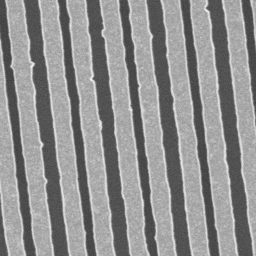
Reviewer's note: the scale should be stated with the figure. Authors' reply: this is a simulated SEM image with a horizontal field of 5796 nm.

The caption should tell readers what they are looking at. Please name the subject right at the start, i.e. parallel lines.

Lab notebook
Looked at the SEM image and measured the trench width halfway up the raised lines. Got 270 nanometers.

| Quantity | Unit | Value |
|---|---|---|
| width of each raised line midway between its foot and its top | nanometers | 416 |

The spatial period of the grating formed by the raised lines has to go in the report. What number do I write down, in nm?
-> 692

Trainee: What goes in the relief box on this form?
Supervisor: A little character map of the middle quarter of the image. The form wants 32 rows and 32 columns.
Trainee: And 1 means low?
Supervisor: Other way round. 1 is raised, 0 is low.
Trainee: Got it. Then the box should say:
00111110000111100011110000111110
00011110000111110011110000111110
00011110000111110011111000111110
00011110000111110011111000011110
00011111000111110001111000011110
10011111000011110001111000011110
10001111000011110001111000011110
10001111000011110001111000011111
10001111000011110001111100011111
10001111000011111001111100011111
11001111000011111001111100011111
11001111000011111001111100001111
11001111100011111001111100001111
11001111100001111001111100001111
11001111100001111000111100001111
11001111100001111000111100001111
11001111100001111000111100001111
11000111100001111000111110000111
11000111100001111100111110000111
11000111100001111100111110000111
11100111100001111100111110000111
11100111110001111100111110000111
11100111110000111100011110000111
11100111110000111100011110000111
11100011110000111100011110000111
11100011110000111100011110000111
11100011110000111110011110000011
11100011110000111110011111000011
11100011110000111110011111000011
11100011111000111110011111000011
11110011111000011110001111000011
11110011111000011110001111000011